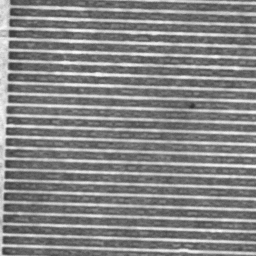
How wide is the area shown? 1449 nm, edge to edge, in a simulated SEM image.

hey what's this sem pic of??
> parallel lines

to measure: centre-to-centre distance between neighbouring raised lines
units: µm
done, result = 0.0615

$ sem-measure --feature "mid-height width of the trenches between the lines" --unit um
0.0481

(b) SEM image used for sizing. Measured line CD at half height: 14.8 nanometres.